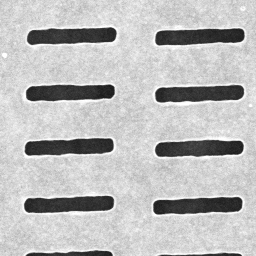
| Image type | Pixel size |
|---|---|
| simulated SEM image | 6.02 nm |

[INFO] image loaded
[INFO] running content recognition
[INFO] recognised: a regular array of holes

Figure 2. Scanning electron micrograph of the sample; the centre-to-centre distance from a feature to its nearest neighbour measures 335 nm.